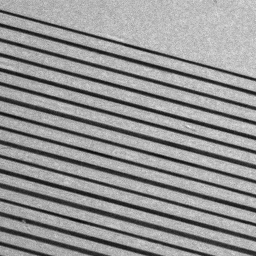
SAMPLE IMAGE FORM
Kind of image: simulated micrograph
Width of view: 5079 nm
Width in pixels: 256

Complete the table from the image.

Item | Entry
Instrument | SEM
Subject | parallel lines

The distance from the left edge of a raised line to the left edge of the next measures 279 nanometers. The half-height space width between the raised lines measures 74.3 nanometers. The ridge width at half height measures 204 nanometers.